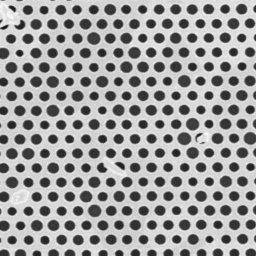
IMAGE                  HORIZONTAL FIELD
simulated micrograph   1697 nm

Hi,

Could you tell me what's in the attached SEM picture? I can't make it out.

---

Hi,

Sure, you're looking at a regular array of holes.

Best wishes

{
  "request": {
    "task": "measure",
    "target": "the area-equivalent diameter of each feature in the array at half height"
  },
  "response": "0.0706 um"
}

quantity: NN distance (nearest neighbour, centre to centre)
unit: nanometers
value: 107